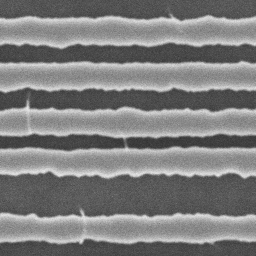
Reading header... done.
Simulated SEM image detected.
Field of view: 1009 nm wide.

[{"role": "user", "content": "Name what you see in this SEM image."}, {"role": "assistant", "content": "lines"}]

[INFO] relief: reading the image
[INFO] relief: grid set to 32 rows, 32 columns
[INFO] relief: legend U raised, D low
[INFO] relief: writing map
DDDDDDDDDDDDDDDDDDDDDDDDDDDDDDDD
DDDDDDDDDDDDDDDDDDDDDDDDDDDDDDDD
UUUUUUUUUUUUUUUUUUUUUUDUUUUUUUUU
UUUUUUUUUUUUUUUUUUUUUUUUUUUUUUUU
UUUUUUUUUUUUUUUUUUUUUUUUUUUUUUUU
UDUUUUUUUUUUUUUUUUUUUDDUUUUUUUUU
DDDDDDDDDDDDDDDDDDDDDDDDDDDDDDDD
DDDDDDDDDDDDDDDDDDDDDDDDDDDDDDDD
UUUUUUUUUUUUUUUUUUUUUUUUUUUUUUUU
UUUUUUUUUUUUUUUUUUUUUUUUUUUUUUUU
UUUUUUUUUUUUUUUUUUUUUUUUUUUUUUUU
DDDDDDDDDDDDDDDDDDDDDDDDDDDDDDDD
DDDDDDDDDDDDDDDDDDDDDDDDDDDDDDDD
DDDUDDDDDDDDDDDUUDDDDDDDDDDDDDDD
UUUUUUUUUUUUUUUUUUUUUUUUUUUUUUUU
UUUUUUUUUUUUUUUUUUUUUUUUUUUUUUUU
UUUUUUUUUUUUUUUUUUUUUUUUUUUUUUUU
DDDDDDDDDDDDDDDDDDDDDDDDDDDDDDDD
DDDUUDDDDDDDDDDUDDDDDUUUUUDDUUUU
UUUUUUUUUUUUUUUUUUUUUUUUUUUUUUUU
UUUUUUUUUUUUUUUUUUUUUUUUUUUUUUUU
UUUUUUUUUUUUUUUUUUUUUUUUUUUUUUUU
DDDDDDDDDDDDDDDDDDDDDDDDDDDDDDDD
DDDDDDDDDDDDDDDDDDDDDDDDDDDDDDDD
DDDDDDDDDDDDDDDDDDDDDDDDDDDDDDDD
DDDDDDDDDDDDDDDDDDDDDDDDDDDDDDDD
DDDDDDDDDDDDDDDDDDDDDDDDDDDDDDDD
UUUUUUUUUUUUUUUUUUUUUUUUUUUUUUUU
UUUUUUUUUUUUUUUUUUUUUUUUUUUUUUUU
UUUUUUUUUUUUUUUUUUUUUUUUUUUUUUUU
DDDDDDDDDDDDDDDDDDDDDDDDDDDDDDDD
DDDDDDDDDDDDDDDDDDDDDDDDDDDDDDDD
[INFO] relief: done